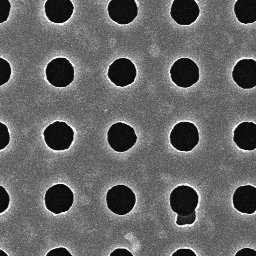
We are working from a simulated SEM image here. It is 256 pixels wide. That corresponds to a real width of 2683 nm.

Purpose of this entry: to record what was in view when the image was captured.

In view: a regular array of holes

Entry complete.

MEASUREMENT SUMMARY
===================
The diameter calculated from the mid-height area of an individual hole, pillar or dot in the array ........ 310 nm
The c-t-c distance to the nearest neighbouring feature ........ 0.654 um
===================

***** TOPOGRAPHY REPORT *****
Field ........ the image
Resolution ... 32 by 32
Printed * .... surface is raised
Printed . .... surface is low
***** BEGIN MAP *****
.*****...*****...*****...****...
.*****...****....****....****...
.*****..******...*****..******..
********************************
********************************
********************************
********************************
.******.*******.******..******..
.*****...*****...****....****...
.*****...*****...****....****...
.*****...*****..******..******..
********************************
********************************
********************************
********************************
******..******..******..******..
.****....*****...****....****...
.*****...*****...****....****...
******...*****..******..******..
********************************
********************************
********************************
********************************
******...*****..******..******..
.*****...****....****....****...
.*****...****....****....****...
******..******..******..******..
**********************..********
********************************
********************************
********************************
.*****...*****..******..******..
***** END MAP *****